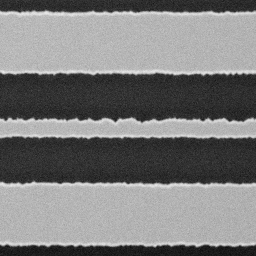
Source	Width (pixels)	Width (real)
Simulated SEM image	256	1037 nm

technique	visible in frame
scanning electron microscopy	lines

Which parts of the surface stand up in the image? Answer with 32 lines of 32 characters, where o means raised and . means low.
................................
oooooooo...o..ooooooo....oo.o.oo
oooooooooooooooooooooooooooooooo
oooooooooooooooooooooooooooooooo
oooooooooooooooooooooooooooooooo
oooooooooooooooooooooooooooooooo
oooooooooooooooooooooooooooooooo
oooooooooooooooooooooooooooooooo
oooooooooooooooooooooooooooooooo
................................
................................
................................
................................
................................
................................
oooooooooooooooooooooooooooooooo
oooooooooooooooooooooooooooooooo
................................
................................
................................
................................
................................
................................
oooooooooooooooooooooooooooooooo
oooooooooooooooooooooooooooooooo
oooooooooooooooooooooooooooooooo
oooooooooooooooooooooooooooooooo
oooooooooooooooooooooooooooooooo
oooooooooooooooooooooooooooooooo
oooooooooooooooooooooooooooooooo
oooooooooooooooooooooooooooooooo
................................